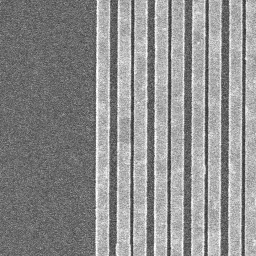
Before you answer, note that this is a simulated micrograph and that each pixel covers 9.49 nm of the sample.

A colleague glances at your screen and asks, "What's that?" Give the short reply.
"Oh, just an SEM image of parallel lines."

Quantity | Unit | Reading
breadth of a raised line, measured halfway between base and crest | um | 0.12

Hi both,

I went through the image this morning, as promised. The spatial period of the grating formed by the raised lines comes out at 180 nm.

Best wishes